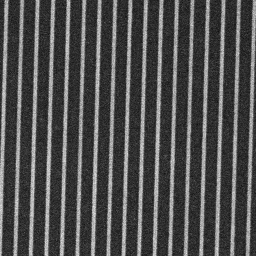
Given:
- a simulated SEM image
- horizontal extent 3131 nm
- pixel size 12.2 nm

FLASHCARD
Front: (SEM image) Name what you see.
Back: parallel lines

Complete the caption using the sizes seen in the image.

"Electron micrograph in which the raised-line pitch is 189 nm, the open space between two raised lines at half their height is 158 nm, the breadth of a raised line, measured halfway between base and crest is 33.6 nm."